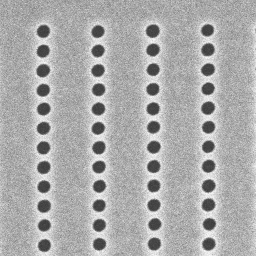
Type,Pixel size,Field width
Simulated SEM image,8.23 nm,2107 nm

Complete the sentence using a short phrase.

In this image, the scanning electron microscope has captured a regular array of holes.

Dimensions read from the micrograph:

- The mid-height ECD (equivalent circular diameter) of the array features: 110 nanometers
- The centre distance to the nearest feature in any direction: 158 nanometres